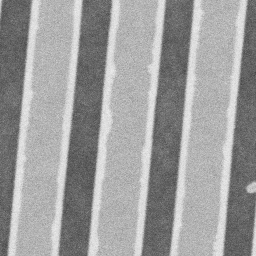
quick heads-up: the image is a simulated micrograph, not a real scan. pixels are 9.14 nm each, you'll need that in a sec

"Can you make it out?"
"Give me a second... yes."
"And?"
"one or a few lines or trenches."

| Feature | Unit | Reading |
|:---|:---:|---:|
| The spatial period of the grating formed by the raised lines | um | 0.743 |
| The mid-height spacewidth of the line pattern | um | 0.324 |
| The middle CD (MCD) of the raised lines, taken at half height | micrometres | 0.427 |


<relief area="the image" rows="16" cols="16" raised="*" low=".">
..***..***..***.
..***..***..***.
..***..***..***.
..***..***..***.
..***..***..***.
..**...***..***.
..**...***..***.
.***...**...**..
.***..***...**..
.***..***..***..
.***..***..***..
.***..***..***..
.***..***..***..
.***..***..***..
.***..***..***..
.**...***..***..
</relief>